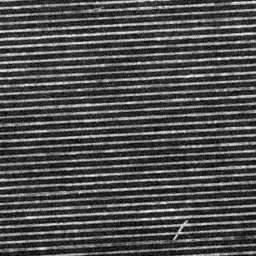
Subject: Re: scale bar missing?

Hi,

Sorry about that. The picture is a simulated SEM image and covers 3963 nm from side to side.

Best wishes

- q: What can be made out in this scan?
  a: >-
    parallel lines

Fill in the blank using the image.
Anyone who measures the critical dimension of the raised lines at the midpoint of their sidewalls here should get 0.0232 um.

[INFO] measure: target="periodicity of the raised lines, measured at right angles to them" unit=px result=7.81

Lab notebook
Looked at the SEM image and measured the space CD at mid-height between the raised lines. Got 5.99 pixels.